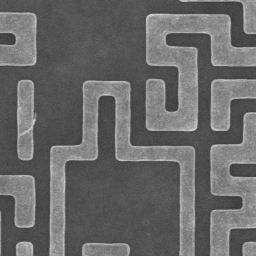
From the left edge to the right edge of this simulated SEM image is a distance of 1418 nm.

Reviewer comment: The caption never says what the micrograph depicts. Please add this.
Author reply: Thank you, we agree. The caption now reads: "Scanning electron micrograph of wiring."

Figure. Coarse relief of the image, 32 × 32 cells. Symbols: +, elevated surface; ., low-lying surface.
..............................++
..............................++
++++..............+++++++++++.++
++++..............+++++++++++.++
..++..............+++.....+++...
..++..............+++.....+++...
++++..............+++++++.++++++
++++..............+++++++.++++++
......................+++.......
......................+++.......
..++.......+++++..+++.+++.++++++
..++......++++++..+++.+++.++++++
..++......++..++..+++.+++.+++...
..++......++..++..+++.+++.+++...
..++......++..++..+++++++.+++..+
..++......++..++..+++++++.+++.++
..++......++..++..............++
..++......++..++..............++
..++...+++++..++++++++++...+++++
..++..++++++..++++++++++..++++++
......++..............++..+++...
......++...............+..+++...
++++..++...............+..++++++
++++..++...............+..++++++
.+++..++...............+......++
..++..++...............+......++
..++..++...............+...+++++
..++..++...............+..++++++
......++...............+..++++..
......++...............+..+++...
..++..++...+++++.......+..+++..+
..++..++..++++++......++..+++.++